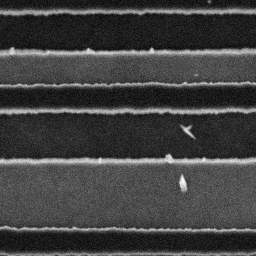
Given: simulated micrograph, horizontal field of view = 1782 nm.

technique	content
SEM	lines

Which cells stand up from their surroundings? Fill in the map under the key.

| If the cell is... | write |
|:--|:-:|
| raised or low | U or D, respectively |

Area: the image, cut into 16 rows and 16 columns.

UUUUUUUUUUUUUUUU
DDDDDDDDDDDDDDDD
DDDDDDDDDDDDDDDD
UUUUUUUUUUUUUUUU
UUUUUUUUUUUUUUUU
UUUUUUUUUUUUUUUU
UUUUUUUUUUUUUUUU
DDDDDDDDDDDDDDDD
DDDDDDDDDDDDDDDD
DDDDDDDDDDDDDDDD
UUUUUUUUUUUUUUUU
UUUUUUUUUUUUUUUU
UUUUUUUUUUUUUUUU
UUUUUUUUUUUUUUUU
UUUUUUUUUUUUUUUU
UUUUUUUUUUUUUUUU